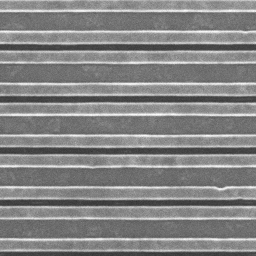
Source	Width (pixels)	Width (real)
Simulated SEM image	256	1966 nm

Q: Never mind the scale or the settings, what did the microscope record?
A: parallel lines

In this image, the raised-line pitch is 200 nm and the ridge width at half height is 94.1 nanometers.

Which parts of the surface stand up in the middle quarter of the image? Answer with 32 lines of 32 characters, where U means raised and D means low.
DDDDDDDDDDDDDDDDDDDDDDDDDDDDDDDD
DDDDDDDDDDDDDDDDDDDDDDDDDDDDDDDD
DDDDDDDDDDDDDDDDDDDDDDDDDDDDDDDD
DDDDDDDDDDDDDDDDDDDDDDDDDDDDDDDD
DDDDDDDDDDDDDDDDDDDDDDDDDDDDDDDD
UUUUUUUUUUUUUUUUUUUUUUUUUUUUUUUU
UUUUUUUUUUUUUUUUUUUUUUUUUUUUUUUU
UUUUUUUUUUUUUUUUUUUUUUUUUUUUUUUU
DDDDDDDDDDDDDDDDDDDDDDDDDDDDDDDD
DDDDDDDDDDDDDDDDDDDDDDDDDDDDDDDD
UUUUUUUUUUUUUUUUUUUUUUUUUUUUUUUU
UUUUUUUUUUUUUUUUUUUUUUUUUUUUUUUU
UUUUUUUUUUUUUUUUUUUUDUUUUDDUUUUU
DDDDDDDDDDDDDDDDDDDDDDDDDDDDDDDD
DDDDDDDDDDDDDDDDDDDDDDDDDDDDDDDD
DDDDDDDDDDDDDDDDDDDDDDDDDDDDDDDD
DDDDDDDDDDDDDDDDDDDDDDDDDDDDDDDD
DDDDDDDDDDDDDDDDDDDDDDDDDDDDDDDD
UUUUUUUUUUUUUUUUUUUUUUUUUUUUUUUU
UUUUUUUUUUUUUUUUUUUUUUUUUUUUUUUU
UUUUUUUUUUUUUUUUUUUUUUUUUUUUUUUU
DDDDDDDDDDDDDDDDDDDDDDDDDDDDDDDD
DDDDDDDDDDDDDDDDDDDDDDDDDDDDDDDD
UUUUUUUUUUUUUUUUUUUUUUUUUUUUUUUU
UUUUUUUUUUUUUUUUUUUUUUUUUUUUUUUU
UUUUUUUUUUUUUUUUUUUUUUUUUUUUUUUU
DDDDDDDDDDDDDDDDDDDDDDDDDDDDDDDD
DDDDDDDDDDDDDDDDDDDDDDDDDDDDDDDD
DDDDDDDDDDDDDDDDDDDDDDDDDDDDDDDD
DDDDDDDDDDDDDDDDDDDDDDDDDDDDDDDD
DDDDDDDDDDDDDDDDDDDDDDDDDDDDDDDD
UUUUUUUUUUUUUUUUUUUUUUUUUUUUUUUU